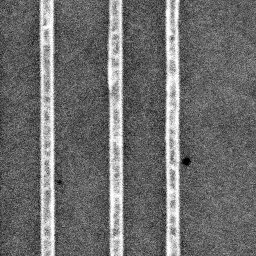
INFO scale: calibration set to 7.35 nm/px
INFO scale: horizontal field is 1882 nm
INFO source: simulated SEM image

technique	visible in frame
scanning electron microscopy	one or a few lines or trenches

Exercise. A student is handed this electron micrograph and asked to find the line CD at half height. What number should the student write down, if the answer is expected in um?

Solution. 0.0763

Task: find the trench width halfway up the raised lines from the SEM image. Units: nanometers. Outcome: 384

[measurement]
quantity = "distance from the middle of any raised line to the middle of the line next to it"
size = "462 nanometers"